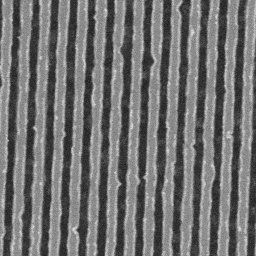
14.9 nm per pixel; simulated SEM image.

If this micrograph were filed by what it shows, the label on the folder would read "parallel lines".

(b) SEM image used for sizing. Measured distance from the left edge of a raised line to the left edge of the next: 279 nanometres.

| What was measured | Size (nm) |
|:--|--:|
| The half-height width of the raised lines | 141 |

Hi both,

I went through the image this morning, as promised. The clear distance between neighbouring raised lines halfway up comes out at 141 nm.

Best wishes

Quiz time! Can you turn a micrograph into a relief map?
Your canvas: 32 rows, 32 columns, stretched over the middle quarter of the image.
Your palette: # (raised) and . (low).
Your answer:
...##...##..##...##...##..###..#
...##...##..##...##...##..###..#
...##..###..###..##...##..###..#
...##..###..###..##...##..###..#
...##..###..##...##...##..###..#
...##...#...##...##..###..##...#
...##..##...##...##..###..##...#
...##..###..##...##..###..##...#
...##..###..##...##..###..##...#
...##..##...##...##..###..##...#
...##..###..##...##..###..##...#
...##..##...##...##..###..##...#
...##..##...##...##..##...##...#
...##..##...##...##..##...##...#
..###..##...##...##..###..##..##
..###..##...##...##..###..##..##
..###..##..###..###..##...##..##
..##...##..###..##...##...##..##
..##...##..##...##...##...##..##
..##...##...##..##...##...##..##
..##...##..##...##...##...##..##
..##...##..###..##...##...##..##
..##...##..###..##...##...##..##
..##...##...#...##...##...##..##
..##...##...#...##...##...##..##
..##...##..##...##...##...#...##
..##...##..##...##...##..##...##
..##...##..##...##..###..##...##
..##...##..##...##..###..##...##
..##...#...###..###..##..##...##
..##...#...###..##..###..##...##
..##...#...##...##...##..##...##